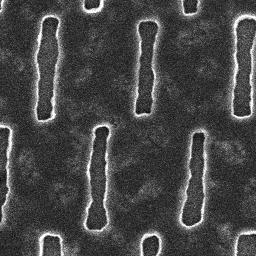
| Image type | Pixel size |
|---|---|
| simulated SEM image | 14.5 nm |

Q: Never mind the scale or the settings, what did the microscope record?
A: holes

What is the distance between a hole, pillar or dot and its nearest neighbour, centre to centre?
1.42 µm